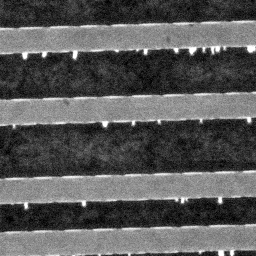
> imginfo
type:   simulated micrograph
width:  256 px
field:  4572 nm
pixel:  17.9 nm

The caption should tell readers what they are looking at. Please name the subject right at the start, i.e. lines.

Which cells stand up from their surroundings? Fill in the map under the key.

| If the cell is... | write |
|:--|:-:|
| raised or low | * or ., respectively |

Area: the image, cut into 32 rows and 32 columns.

................................
................................
................................
......**************************
********************************
********************************
*****...........................
................................
................................
................................
................................
................................
.*******************************
********************************
********************************
*****...........................
................................
................................
................................
................................
................................
..............................**
********************************
********************************
*******************************.
................................
................................
................................
...................*************
********************************
********************************
***********************.........